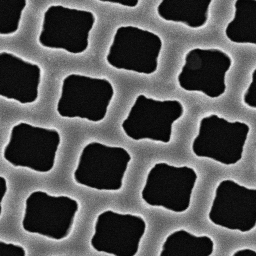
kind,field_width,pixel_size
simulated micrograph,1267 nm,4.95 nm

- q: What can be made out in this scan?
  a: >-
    a regular array of holes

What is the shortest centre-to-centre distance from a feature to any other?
344 nanometers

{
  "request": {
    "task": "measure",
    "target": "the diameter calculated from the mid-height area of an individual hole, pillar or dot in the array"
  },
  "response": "249 nm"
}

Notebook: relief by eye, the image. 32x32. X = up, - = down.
---XXXXXXXXXXXX--XXX------XXX---
---XXX-----XXXXXXXXX------XXX---
--XXX-------XXXXXXXXX-----XXX---
--XXX------XXXX--XXXXXXXXXXX----
XXXXX------XXX------XXXXXXXX----
XXXXX------XXX------XXXXXXXXXXXX
XXXXXXXXX-XXXX------XXXX----XXXX
---XXXXXXXXXX-------XXX------XXX
-----XXXXXXXXXX-----XXX------XXX
-----XXXX--XXXXXXXXXXX------XXXX
-----XXX------XXXXXXXX------XXX-
-----XXX------XXXXXXXXXXX---XXX-
XX--XXX-------XXX--XXXXXXXXXXXX-
XXXXXXX------XXX-------XXXXXXXXX
XXXXXXXX-----XXX-------XXX-XXXXX
XX-XXXXXXXXXXXX-------XXX------X
X------XXXXXXXXX-----XXXX------X
X------XXXXXXXXXXXX--XXX-------X
X------XXXX----XXXXXXXXX------XX
X------XXX------XXXXXXXXX-----XX
X------XXX------XXXX-XXXXXXX-XXX
XXXXX-XXX-------XXX-----XXXXXXXX
-XXXXXXXX------XXX------XXXX-XXX
-XXXXXXXXXXX---XXX------XXX----X
XXXX--XXXXXXXXXXXX------XXX-----
XXX-------XXXXXXXXX-----XXX-----
XXX-------XXX-XXXXXXXXXXXX------
XXX------XXX------XXXXXXXX------
XXX------XXX------XXXXXXXXXX----
XXXXXX--XXXX------XXX----XXXXXXX
-XXXXXXXXXX------XXX-------XXXXX
---XXXXXXXXXX----XXX------XXXX--